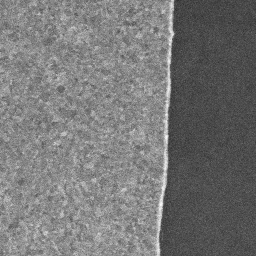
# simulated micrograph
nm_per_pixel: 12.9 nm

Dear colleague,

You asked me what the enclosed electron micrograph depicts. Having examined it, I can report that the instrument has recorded one or a few lines or trenches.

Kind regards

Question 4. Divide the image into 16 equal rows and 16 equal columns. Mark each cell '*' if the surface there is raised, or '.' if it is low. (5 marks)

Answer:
***********.....
***********.....
***********.....
***********.....
***********.....
***********.....
**********......
**********......
**********......
**********......
**********......
**********......
**********......
**********......
**********......
**********......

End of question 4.